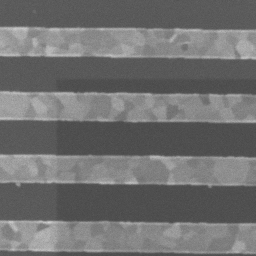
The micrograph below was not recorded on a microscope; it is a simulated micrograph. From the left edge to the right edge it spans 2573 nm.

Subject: lines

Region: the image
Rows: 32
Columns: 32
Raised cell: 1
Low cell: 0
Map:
00000000000000000000000000000000
00000000000000000000000000000000
00000000000000000000000000000000
00000000000000000000000000000000
11111111111111111111111111111111
11111111111111111111111111111111
11111111111111111111111111111111
00000000000000000000000000000000
00000000000000000000000000000000
00000000000000000000000000000000
00000000000000000000000000000000
10000000000000000000000000000000
11111111111111111111111111111111
11111111111111111111111111111111
11111111111111111111111111111111
00000000000000000000000000000000
00000000000000000000000000000000
00000000000000000000000000000000
00000000000000000000000000000000
01111000000000000000000000000000
11111111111111111111111111111111
11111111111111111111111111111111
11111111111111111111111111111111
00000000000000000000000000000000
00000000000000000000000000000000
00000000000000000000000000000000
00000000000000000000000000000000
00000000000000000000000000000000
11111111111111111111111111111111
11111111111111111111111111111111
11111111111111111111111111111111
00000000000000000000001111111111